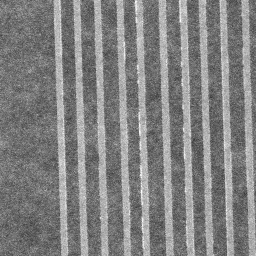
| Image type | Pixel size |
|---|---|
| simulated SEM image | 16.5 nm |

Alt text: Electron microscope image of parallel lines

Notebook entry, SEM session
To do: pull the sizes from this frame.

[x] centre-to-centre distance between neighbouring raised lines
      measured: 0.345 um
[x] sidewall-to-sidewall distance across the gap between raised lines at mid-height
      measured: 0.236 um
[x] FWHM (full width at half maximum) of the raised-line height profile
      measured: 105 nm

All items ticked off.